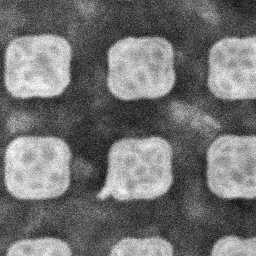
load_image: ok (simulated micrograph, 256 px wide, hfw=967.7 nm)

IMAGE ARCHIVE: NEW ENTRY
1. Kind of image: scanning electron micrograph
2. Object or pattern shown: raised bodies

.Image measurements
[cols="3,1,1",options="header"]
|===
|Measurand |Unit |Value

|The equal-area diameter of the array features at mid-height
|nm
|252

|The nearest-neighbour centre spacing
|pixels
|101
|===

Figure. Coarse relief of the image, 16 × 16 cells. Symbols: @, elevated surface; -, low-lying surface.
----------------
----------------
-@@@----@@----@@
@@@@---@@@@--@@@
@@@@---@@@@--@@@
-@@@---@@@@--@@@
----------------
----------------
----------------
@@@@---@@@@--@@@
@@@@---@@@@--@@@
@@@@---@@@@--@@@
----------------
----------------
----------------
-@@@---@@@@--@@@